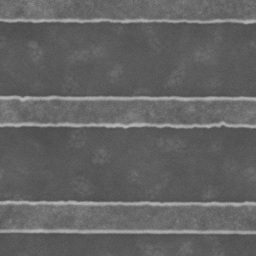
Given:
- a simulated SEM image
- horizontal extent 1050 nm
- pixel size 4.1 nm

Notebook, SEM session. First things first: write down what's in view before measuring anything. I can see one or a few lines or trenches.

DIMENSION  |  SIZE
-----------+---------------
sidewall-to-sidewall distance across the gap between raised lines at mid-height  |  316 nanometres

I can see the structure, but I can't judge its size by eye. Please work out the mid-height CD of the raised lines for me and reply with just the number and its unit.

117 nanometers